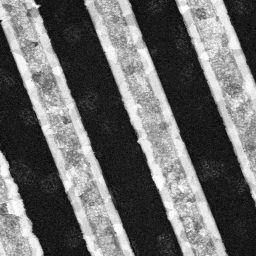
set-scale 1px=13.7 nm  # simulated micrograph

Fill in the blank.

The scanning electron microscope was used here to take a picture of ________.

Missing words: one or a few lines or trenches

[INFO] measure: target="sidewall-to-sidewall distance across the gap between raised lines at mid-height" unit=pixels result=56.4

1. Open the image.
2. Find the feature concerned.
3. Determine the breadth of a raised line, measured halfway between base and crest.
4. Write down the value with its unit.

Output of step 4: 0.408 microns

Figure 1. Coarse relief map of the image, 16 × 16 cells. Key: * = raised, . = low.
**....**....**..
**....**....**..
.**....**...***.
.**....**....**.
..**...**....**.
..**....**...***
..**....**....**
...**....**...**
...**....**....*
....*....**....*
....**....**...*
*...**....**....
*....**...***...
*....**....**...
**...**....**...
**....**....**..